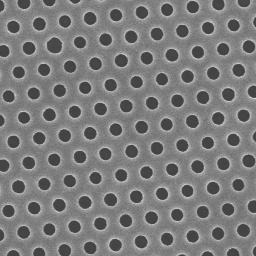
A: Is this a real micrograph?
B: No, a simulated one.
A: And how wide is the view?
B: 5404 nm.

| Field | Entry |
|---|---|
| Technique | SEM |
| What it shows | a regular array of holes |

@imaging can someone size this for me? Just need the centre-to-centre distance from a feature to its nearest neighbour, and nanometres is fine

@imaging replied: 539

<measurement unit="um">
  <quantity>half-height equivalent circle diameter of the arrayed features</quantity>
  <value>0.268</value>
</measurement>